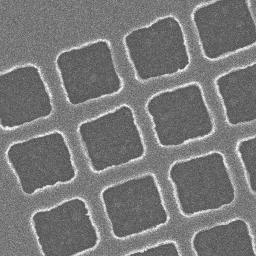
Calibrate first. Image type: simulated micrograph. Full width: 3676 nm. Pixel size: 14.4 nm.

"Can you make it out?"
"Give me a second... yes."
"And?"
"holes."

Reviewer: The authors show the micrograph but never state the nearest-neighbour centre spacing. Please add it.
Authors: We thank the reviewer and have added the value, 1010 nm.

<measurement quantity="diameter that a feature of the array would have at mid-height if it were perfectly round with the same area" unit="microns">0.851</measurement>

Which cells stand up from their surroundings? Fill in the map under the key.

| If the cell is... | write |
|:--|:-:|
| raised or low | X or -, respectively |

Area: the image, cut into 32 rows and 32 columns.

XXXXXXXXXXXXXXXXXXXXXXXXXX-----X
XXXXXXXXXXXXXXXXXXXXXXXX-------X
XXXXXXXXXXXXXXXXXXXX--XX--------
XXXXXXXXXXXXXXXXXX-----XX-------
XXXXXXXXXXXXXXXX-------XX-------
XXXXXXXXXXX--XXX-------XX------X
XXXXXXXX------XX-------XXX---XXX
XXXXXXX-------XX--------XXXXXXXX
XX--XXX-------XXX------XXXXXXXX-
-----XXX-------XX---XXXXXXXX----
-----XXX-------XXXXXXXXXXXX-----
------XX------XXXXXXX----XX-----
------XXX--XXXXXXXX------XXX----
------XXXXXXXXX-XXX-------XX----
------XXXXXXX----XX-------XX----
---XXXXXXX-------XX-------XXXXXX
XXXXXXXXXX-------XXX------XXXXXX
XXXX----XX--------XX---XXXXXXXX-
X-------XXX-------XXXXXXXXXXXX--
X--------XX-------XXXXXXXX--XX--
X--------XX----XXXXXXX------XXX-
XX-------XXXXXXXXXXXX-------XXX-
XX-------XXXXXXX---XXX-------XX-
XXX--XXXXXXXXX------XX-------XX-
XXXXXXXXXXXXX-------XX-------XXX
XXXXXXXX---XX-------XXX-----XXXX
XXXXX------XX--------XX--XXXXXXX
XXXX-------XXX-------XXXXXXXXXXX
XXXX--------XX-----XXXXXXX-----X
XXXXX-------XXX-XXXXXXXX-------X
XXXXX-------XXXXXXXXX-XX-------X
XXXXX-----XXXXXXXX----XXX-------